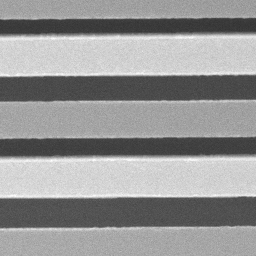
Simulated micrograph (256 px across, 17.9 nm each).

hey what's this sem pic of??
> lines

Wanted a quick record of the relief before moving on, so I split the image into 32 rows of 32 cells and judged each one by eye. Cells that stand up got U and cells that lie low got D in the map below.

UUUUUUUUUUUUUUUUUUUUUUUUUUUUUUUU
UUUUUUUUUUUUUUUUUUUUUUUUUUUUUUUU
DDDDDDDDDDDDDDDDDDDDDDDDDDDDDDDD
DDDDDDDDDDDDDDDDDDDDDDDDDDDDDDDD
UUUUUUUUUUUUUUUUUUUUUUUUUUUUUUUU
UUUUUUUUUUUUUUUUUUUUUUUUUUUUUUUU
UUUUUUUUUUUUUUUUUUUUUUUUUUUUUUUU
UUUUUUUUUUUUUUUUUUUUUUUUUUUUUUUU
UUUUUUUUUUUUUUUUUUUUUUUUUUUUUUUU
UUDDDDDDDDDDDDDDDDDDDDDDDDDDDDDD
DDDDDDDDDDDDDDDDDDDDDDDDDDDDDDDD
DDDDDDDDDDDDDDDDDDDDDDDDDDDDDDDD
DDDDDDDDDDDDDDDDDDDDDDDDDDDDDDDD
UUUUUUUUUUUUUUUUUUUUUUUUUUUUUUUU
UUUUUUUUUUUUUUUUUUUUUUUUUUUUUUUU
UUUUUUUUUUUUUUUUUUUUUUUUUUUUUUUU
UUUUUUUUUUUUUUUUUUUUUUUUUUUUUUUU
DDDDDDDDDDDDDDDDDDDDDDDDDDDDDDDD
DDDDDDDDDDDDDDDDDDDDDDDDDDDDDDDD
DDDDDDDDDDDDDDDDDDDDDDDDDDDDDDDU
UUUUUUUUUUUUUUUUUUUUUUUUUUUUUUUU
UUUUUUUUUUUUUUUUUUUUUUUUUUUUUUUU
UUUUUUUUUUUUUUUUUUUUUUUUUUUUUUUU
UUUUUUUUUUUUUUUUUUUUUUUUUUUUUUUU
UUUUUUUUUUUUUUUUUUUUUUUUUUUDDDDD
DDDDDDDDDDDDDDDDDDDDDDDDDDDDDDDD
DDDDDDDDDDDDDDDDDDDDDDDDDDDDDDDD
DDDDDDDDDDDDDDDDDDDDDDDDDDDDDDDD
DDDDDDDDDDDUUUUUUUUUUUUUUUUUUUUU
UUUUUUUUUUUUUUUUUUUUUUUUUUUUUUUU
UUUUUUUUUUUUUUUUUUUUUUUUUUUUUUUU
UUUUUUUUUUUUUUUUUUUUUUUUUUUUUUUU